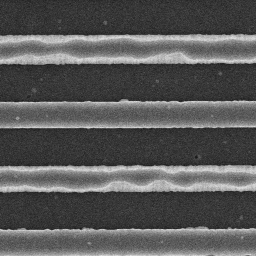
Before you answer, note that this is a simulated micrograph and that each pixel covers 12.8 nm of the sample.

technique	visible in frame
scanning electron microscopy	lines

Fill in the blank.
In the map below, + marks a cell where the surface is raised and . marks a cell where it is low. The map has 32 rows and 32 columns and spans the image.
................................
................................
................................
................................
...............+................
++++++++++++++++++++++++++++++++
++++++++++++++++++++++++++++++++
++++++++++++++++++++++++++++++++
................................
................................
................................
................................
................................
++++++++++++++++++++++++++++++++
++++++++++++++++++++++++++++++++
++++++++++++++++++++++++++++++++
................................
................................
................................
................................
................................
++++++++++++++++++++++++++++++++
++++++++++++++++++++++++++++++++
++++++++++++++++++++++++++++++++
................................
................................
................................
................................
................................
++++++++++++++++++++++++++++++++
++++++++++++++++++++++++++++++++
++++++++++++++++++++++++++++++++